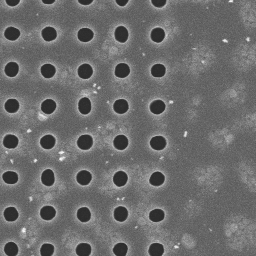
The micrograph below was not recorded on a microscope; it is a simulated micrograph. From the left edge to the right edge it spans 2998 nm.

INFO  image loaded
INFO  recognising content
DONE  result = a regular array of holes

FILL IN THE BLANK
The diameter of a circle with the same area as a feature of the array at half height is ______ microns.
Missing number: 0.176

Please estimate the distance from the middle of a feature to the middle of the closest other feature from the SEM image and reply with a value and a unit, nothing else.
418 nm